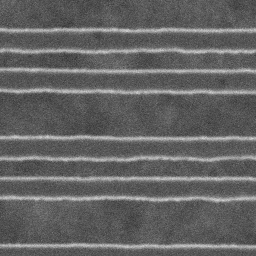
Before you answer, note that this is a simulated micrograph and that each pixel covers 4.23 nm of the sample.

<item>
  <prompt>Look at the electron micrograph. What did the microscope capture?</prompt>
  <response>lines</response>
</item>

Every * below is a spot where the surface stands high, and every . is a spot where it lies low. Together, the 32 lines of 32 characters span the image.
................................
................................
................................
................................
********************************
********************************
..***.....****.........**..*.***
................................
................................
********************************
********************************
..*.....****.*******************
................................
................................
................................
................................
................................
********************************
********************************
********************************
................................
................................
********************************
********************************
********************************
................................
................................
................................
................................
................................
................................
********************************